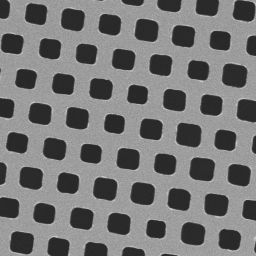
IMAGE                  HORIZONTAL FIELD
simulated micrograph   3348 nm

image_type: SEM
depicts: a regular array of holes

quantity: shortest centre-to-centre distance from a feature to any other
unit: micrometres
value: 0.485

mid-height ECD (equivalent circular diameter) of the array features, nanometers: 301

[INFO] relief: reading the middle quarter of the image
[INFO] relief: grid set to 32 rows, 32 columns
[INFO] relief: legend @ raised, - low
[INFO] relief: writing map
@@@@@@@@@@@@-----@@@@------@@@@-
@@@@@@@@@@@@@@---@@@@------@@@@-
@@@@@@@@@@@@@@@@@@@@@@----@@@@@-
---@@@@@@@@@@@@@@@@@@@@@@@@@@@@-
---@@@@-----@@@@@@@@@@@@@@@@@@@@
---@@@------@@@@@--@@@@@@@@@@@@@
---@@@------@@@@-----@@@@----@@@
--@@@@------@@@@-----@@@@-----@@
@@@@@@@----@@@@@-----@@@@------@
@@@@@@@@@@@@@@@@----@@@@@-----@@
@@@@@@@@@@@@@@@@@@@@@@@@@-----@@
@-----@@@@@@@@@@@@@@@@@@@@@---@@
@-----@@@@@@@@@@@@@@@@@@@@@@@@@@
------@@@@-----@@@@@@@@@@@@@@@@@
------@@@@-----@@@@-----@@@@@@@@
@-----@@@@-----@@@@------@@@----
@@@@@@@@@@-----@@@@------@@@----
@@@@@@@@@@@@@@@@@@@-----@@@@----
@@@@@@@@@@@@@@@@@@@@----@@@@----
@@@@@@@@@@@@@@@@@@@@@@@@@@@@----
-@@@-----@@@@@@@@@@@@@@@@@@@@@@-
-@@@-----@@@@@----@@@@@@@@@@@@@@
@@@@-----@@@@------@@@@@--@@@@@@
@@@@-----@@@@------@@@@-----@@@@
@@@@@----@@@@------@@@------@@@@
@@@@@@@@@@@@@------@@@------@@@-
@@@@@@@@@@@@@@@@@-@@@@@-----@@@-
--@@@@@@@@@@@@@@@@@@@@@@@--@@@@-
----@@@@---@@@@@@@@@@@@@@@@@@@@@
----@@@------@@@@@@@@@@@@@@@@@@@
----@@@------@@@@-----@@@@@@@@@@
---@@@@------@@@@------@@@@---@@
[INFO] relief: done